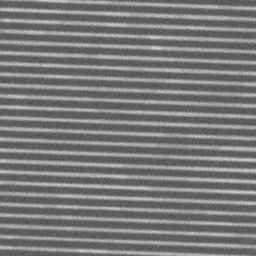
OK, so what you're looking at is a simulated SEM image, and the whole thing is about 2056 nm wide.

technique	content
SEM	parallel lines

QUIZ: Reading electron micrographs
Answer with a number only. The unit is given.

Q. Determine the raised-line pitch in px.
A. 10.8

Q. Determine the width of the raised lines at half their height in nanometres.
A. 13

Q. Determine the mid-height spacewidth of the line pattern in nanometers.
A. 70.2